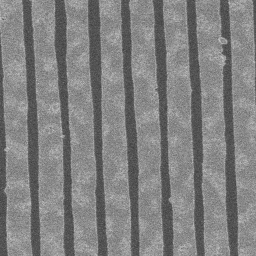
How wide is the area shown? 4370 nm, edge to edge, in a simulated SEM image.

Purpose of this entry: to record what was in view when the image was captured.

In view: parallel lines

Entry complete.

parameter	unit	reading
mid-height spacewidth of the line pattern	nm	173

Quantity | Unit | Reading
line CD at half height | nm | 384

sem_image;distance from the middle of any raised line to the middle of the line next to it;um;0.56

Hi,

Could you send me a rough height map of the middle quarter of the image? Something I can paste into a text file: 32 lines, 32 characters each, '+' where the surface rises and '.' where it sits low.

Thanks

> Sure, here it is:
.+++++...+++++...++++++...+++++.
.+++++....+++++..++++++...+++++.
.+++++....+++++..++++++...+++++.
.+++++...++++++..++++++...+++++.
.+++++...++++++..++++++...+++++.
.++++++...+++++...+++++...++++++
.++++++...+++++...+++++...++++++
.++++++...+++++...+++++...++++++
.++++++...+++++...++++++..++++++
.++++++...+++++...++++++..++++++
.++++++..++++++...++++++..++++++
.++++++..++++++...++++++..++++++
.++++++...+++++...++++++..++++++
.++++++...+++++...++++++..++++++
.++++++...+++++...++++++..++++++
.++++++...+++++...++++++..++++++
..+++++...+++++...++++++..++++++
..+++++...+++++...++++++..++++++
..+++++...+++++...++++++..++++++
..+++++...+++++...++++++..++++++
..+++++...++++++..++++++..++++++
..+++++...++++++..++++++..++++++
..+++++...++++++...+++++..++++++
..++++++..++++++...+++++..++++++
..++++++..++++++...+++++..++++++
..++++++..++++++...+++++..++++++
..++++++..++++++...+++++..++++++
..++++++..++++++...+++++..++++++
..++++++..++++++...+++++...+++++
..++++++..++++++...+++++...+++++
..++++++..++++++...+++++...+++++
..++++++..++++++...+++++...+++++